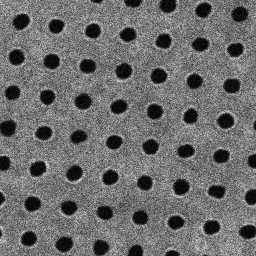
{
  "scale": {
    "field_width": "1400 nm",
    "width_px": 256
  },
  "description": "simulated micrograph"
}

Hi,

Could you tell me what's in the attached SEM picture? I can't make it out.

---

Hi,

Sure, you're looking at a regular array of holes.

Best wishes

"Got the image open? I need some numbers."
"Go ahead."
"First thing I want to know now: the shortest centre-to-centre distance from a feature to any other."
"0.193 microns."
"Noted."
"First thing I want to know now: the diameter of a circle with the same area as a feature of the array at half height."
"0.0838 um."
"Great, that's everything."